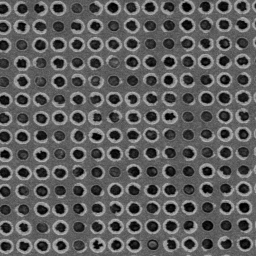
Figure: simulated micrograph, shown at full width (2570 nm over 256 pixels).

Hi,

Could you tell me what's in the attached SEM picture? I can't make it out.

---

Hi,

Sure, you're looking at a regular array of holes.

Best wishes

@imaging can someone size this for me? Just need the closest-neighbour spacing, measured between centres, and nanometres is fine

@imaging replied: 179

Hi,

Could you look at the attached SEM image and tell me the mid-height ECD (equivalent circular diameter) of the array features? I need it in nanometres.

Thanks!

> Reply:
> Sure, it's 104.